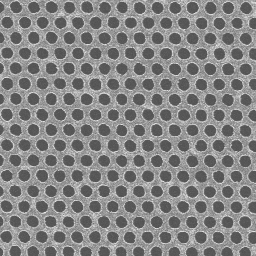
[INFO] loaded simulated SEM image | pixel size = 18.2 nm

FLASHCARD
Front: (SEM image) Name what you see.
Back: a regular array of holes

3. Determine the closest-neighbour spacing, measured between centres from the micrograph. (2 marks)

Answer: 314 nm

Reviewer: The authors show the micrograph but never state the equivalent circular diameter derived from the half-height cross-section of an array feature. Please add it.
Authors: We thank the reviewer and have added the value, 11.8 px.